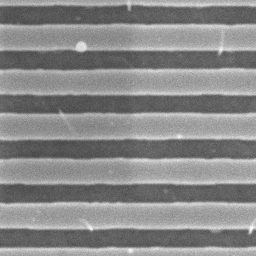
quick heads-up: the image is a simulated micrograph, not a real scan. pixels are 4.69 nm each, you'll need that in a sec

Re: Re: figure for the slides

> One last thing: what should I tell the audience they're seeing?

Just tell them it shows lines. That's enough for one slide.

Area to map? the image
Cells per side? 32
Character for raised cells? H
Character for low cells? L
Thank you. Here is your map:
HHHHHHHHHHHHHHHHHHHHHHHHHHHHHHHH
LLLLLLLLLLLLLLLLLLLLLLLLLLLLLLLL
LLLLLLLLLLLLLLLLLLLLLLLLLLLLLLLL
HHHHHHHHHHHHHHHHHHHHHHHHHHHHHHHH
HHHHHHHHHHHHHHHHHHHHHHHHHHHHHHHH
HHHHHHHHHHHHHHHHHHHHHHHHHHHHHHHH
LLLLLLLLLLLLLLLLLLLLLLLLLLLLLLLL
LLLLLLLLLLLLLLLLLLLLLLLLLLLLLLLL
LLLLLLLLLLLLLLLLLLLLLLLLLLLLLLLL
HHHHHHHHHHHHHHHHHHHHHHHHHHHHHHHH
HHHHHHHHHHHHHHHHHHHHHHHHHHHHHHHH
HHHHHHHHHHHHHHHHHHHHHHHHHHHHHHHH
LLLLLLLLLLLLLLLLLLLLLLLLLLLLLLLL
LLLLLLLLLLLLLLLLLLLLLLLLLLLLLLLL
HHHHHHHHHHHHHHHHHHHHHHHHHHHHHHHH
HHHHHHHHHHHHHHHHHHHHHHHHHHHHHHHH
HHHHHHHHHHHHHHHHHHHHHHHHHHHHHHHH
LLLLLLLLLLLLLLLLLLLLLLLLLLLLLLLL
LLLLLLLLLLLLLLLLLLLLLLLLLLLLLLLL
LLLLLLLLLLLLLLLLLLLLLLLLLLLLLLLL
HHHHHHHHHHHHHHHHHHHHHHHHHHHHHHHH
HHHHHHHHHHHHHHHHHHHHHHHHHHHHHHHH
HHHHHHHHHHHHHHHHHHHHHHHHHHHHHHHH
LLLLLLLLLLLLLLLLLLLLLLLLLLLLLLLL
LLLLLLLLLLLLLLLLLLLLLLLLLLLLLLLL
HLHLLHHHHHHHHHHHHHHHHHHHHHHHHHHH
HHHHHHHHHHHHHHHHHHHHHHHHHHHHHHHH
HHHHHHHHHHHHHHHHHHHHHHHHHHHHHHHH
LLLLHHHHHHHHHHLLLLHHHHLLLHHHHLLH
LLLLLLLLLLLLLLLLLLLLLLLLLLLLLLLL
LLLLLLLLLLLLLLLLLLLLLLLLLLLLLLLL
HHHHHHHHHHHHHHHHHHHHHHHHHHHHHHHH